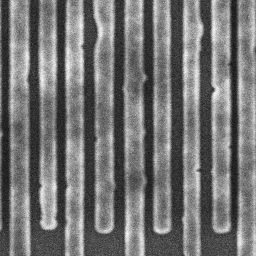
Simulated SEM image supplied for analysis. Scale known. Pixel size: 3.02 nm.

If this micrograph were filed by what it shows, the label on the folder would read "parallel lines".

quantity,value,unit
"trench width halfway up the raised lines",36.6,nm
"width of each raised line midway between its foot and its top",49.8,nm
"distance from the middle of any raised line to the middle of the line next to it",86.1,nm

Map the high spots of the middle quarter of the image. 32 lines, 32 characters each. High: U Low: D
DUUUDDDDUUUUDDDUUUUUDDDUUUDDDDUU
DUUUDDDDUUUUDDDUUUUUDDDUUUDDDDUU
DUUUDDDDUUUUDDDUUUUUDDDUUUDDDDUU
DUUUDDDDUUUUDDDUUUUUDDDUUUDDDDUU
DUUUDDDDUUUUDDDUUUUUDDDUUUDDDDUU
DUUUDDDDUUUUDDDUUUUUDDDUUUDDDDUU
DUUUUDDDUUUUDDDUUUUUDDDUUUDDDDUU
DUUUUDDDUUUUDDDUUUUUDDDUUUDDDDUU
DUUUUDDDUUUUDDDUUUUUDDDUUUDDDDUU
DUUUUDDDUUUUDDDUUUUDDDDUUUDDDDUU
DUUUUDDDUUUUDDDUUUUDDDDUUUDDDDUU
DUUUUDDDUUUUDDDUUUUDDDDUUUUDDDUU
DUUUUDDDUUUUDDDUUUUDDDDUUUDDDDUU
DUUUUDDDUUUUDDDUUUUDDDDUUUDDDDUU
DUUUUDDDUUUUDDDUUUUDDDDUUUDDDDUU
DUUUUDDDUUUUDDDUUUUUDDDUUUDDDDUU
DUUUUDDDUUUUDDDUUUUUDDDUUUDDDDUU
DUUUUDDDUUUUDDDUUUUUDDDUUUDDDDUU
DUUUUDDDUUUUDDDUUUUUDDDUUUDDDDUU
DUUUUDDDUUUUDDDUUUUUDDDUUUDDDDUU
DUUUUDDDUUUUDDDUUUUUDDDUUUDDDDUU
DUUUUDDDUUUUDDDUUUUUDDDUUUDDDDUU
DUUUUDDDUUUUDDDUUUUUDDDUUUDDDDUU
DUUUUDDDUUUUDDDUUUUUDDDUUUDDDDUU
DUUUUDDDUUUUDDDUUUUUDDDUUUDDDDUU
DUUUUDDDUUUUDDDUUUUUDDDUUUDDDDUU
DUUUUDDDUUUUDDDUUUUUDDDUUUDDDDUU
DUUUUDDDUUUUDDDDUUUUDDDUUUDDDDUU
DUUUUDDDUUUUDDDUUUUUDDDUUUDDDDUU
DUUUUDDDUUUUDDDUUUUUDDDUUUDDDDUU
DUUUUDDDUUUUUDDDUUUUDDDUUUDDDDUU
DUUUUDDDUUUUDDDDUUUUDDDUUUDDDDUU